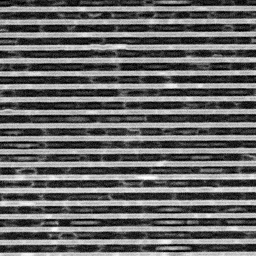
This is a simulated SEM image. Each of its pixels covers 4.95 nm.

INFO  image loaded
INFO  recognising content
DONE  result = parallel lines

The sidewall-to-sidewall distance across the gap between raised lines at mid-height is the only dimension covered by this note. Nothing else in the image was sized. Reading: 0.0409 microns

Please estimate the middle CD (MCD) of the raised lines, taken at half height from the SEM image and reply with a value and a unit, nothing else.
22.9 nm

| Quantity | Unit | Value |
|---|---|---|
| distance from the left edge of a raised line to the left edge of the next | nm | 64.1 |